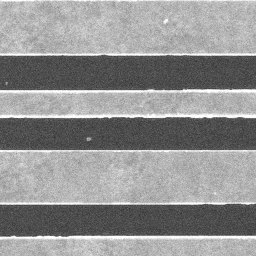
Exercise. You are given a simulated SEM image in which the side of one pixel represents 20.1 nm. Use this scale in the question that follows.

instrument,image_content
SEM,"lines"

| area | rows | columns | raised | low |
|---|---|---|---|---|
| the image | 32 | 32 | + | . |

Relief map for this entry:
++++++++++++++++++++++++++++++++
++++++++++++++++++++++++++++++++
++++++++++++++++++++++++++++++++
++++++++++++++++++++++++++++++++
++++++++++++++++++++++++++++++++
++++++++++++++++++++++++++++++++
++++++++++++++++++++++++++++++++
................................
................................
................................
................................
++++++++++++++++++++++++++++++++
++++++++++++++++++++++++++++++++
++++++++++++++++++++++++++++++++
++++++++++++++++++++++++++++++++
................................
................................
................................
................................
++++++++++++++++++++++++++++++++
++++++++++++++++++++++++++++++++
++++++++++++++++++++++++++++++++
++++++++++++++++++++++++++++++++
++++++++++++++++++++++++++++++++
++++++++++++++++++++++++++++++++
................................
................................
................................
................................
................................
++++++++++++++++++++++++++++++++
++++++++++++++++++++++++++++++++